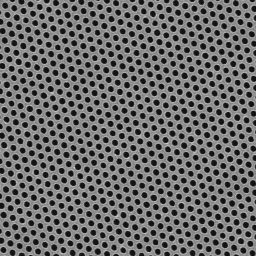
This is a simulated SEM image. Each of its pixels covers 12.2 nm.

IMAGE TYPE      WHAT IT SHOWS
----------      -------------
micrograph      a regular array of holes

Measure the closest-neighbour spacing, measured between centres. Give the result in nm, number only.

114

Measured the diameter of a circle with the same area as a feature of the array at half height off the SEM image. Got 6.28 pixels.